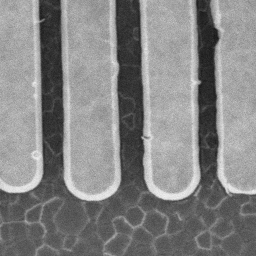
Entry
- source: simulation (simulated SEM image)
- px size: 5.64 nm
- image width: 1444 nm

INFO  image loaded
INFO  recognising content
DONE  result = one or a few lines or trenches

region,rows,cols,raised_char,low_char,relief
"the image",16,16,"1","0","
1100111001110111
1100111001110011
1100111001110011
1100111001110011
1100111001110011
1100111001110011
1100111001110011
1100111001110011
1100111001110011
1110111001110011
1100111001110011
1100111001110011
0000000000000000
0000000000000000
0000000000000000
0000000000000000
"